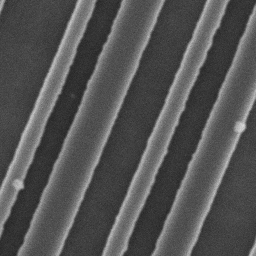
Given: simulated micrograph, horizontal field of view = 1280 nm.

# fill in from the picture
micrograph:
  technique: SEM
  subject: lines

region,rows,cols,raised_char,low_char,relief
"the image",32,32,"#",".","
..........##...#####......##....
.........###...#####.....###....
.........##...######.....###...#
........###...#####......##....#
........##....#####.....###...##
........##...#####......##....##
.......###...#####.....###....##
.......##...#####......###...###
......###...#####.....###....###
......##...######.....###...####
.....###...#####......##....####
.....###...#####.....###...#####
.....##...#####......##....#####
....###...#####.....###....####.
....##...######.....###...#####.
...###...#####......##....#####.
...##....#####.....###...#####..
...##...#####......##....#####..
..###...#####.....###....####...
..##...######.....###...#####...
.###...#####......##....#####...
.##...######.....###...#####....
.##...#####......##....#####....
###...#####.....###...#####.....
##...#####......##....#####.....
##...#####.....###....####......
#...######.....###...#####......
#...#####.....###....#####......
....#####.....###...#####.......
...#####......##....#####.......
...#####.....###....####........
..######.....###...#####.......#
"